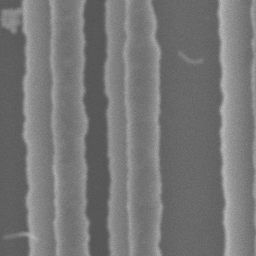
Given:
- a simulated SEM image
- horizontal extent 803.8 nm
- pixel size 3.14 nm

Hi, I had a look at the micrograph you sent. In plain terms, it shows lines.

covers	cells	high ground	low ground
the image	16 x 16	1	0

0111100111000011
0111100111000011
0011100111000011
0011100111000011
0011100111000011
0011100111000011
0011100111000011
0011100111000011
0011100111000011
0011100111000011
0011100111000011
0011100111000011
0011100111000011
0011100111000011
0011110111000011
0011110111000011